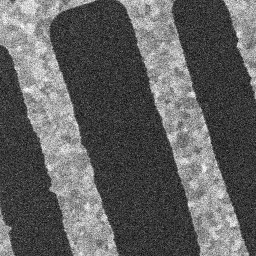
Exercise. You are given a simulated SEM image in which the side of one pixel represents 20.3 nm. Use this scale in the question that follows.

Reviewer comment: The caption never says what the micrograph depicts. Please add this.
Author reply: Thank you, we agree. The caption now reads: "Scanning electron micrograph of one or a few lines or trenches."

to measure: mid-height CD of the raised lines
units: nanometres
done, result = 832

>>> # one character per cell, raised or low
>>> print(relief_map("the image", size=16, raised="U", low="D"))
UUUUDDDDUUUDDDUU
UUUDDDDDUUUDDDDU
UUUDDDDDDUUDDDDU
DUUDDDDDDUUDDDDU
DUUUDDDDDUUUDDDD
DUUUDDDDDUUUDDDD
DDUUDDDDDDUUDDDD
DDUUUDDDDDUUUDDD
DDUUUDDDDDUUUDDD
DDDUUDDDDDDUUDDD
DDDUUUDDDDDUUUDD
DDDUUUDDDDDUUUDD
DDDDUUDDDDDDUUDD
DDDDUUUDDDDDUUUD
UDDDUUUDDDDDUUUD
UDDDUUUDDDDDUUUD